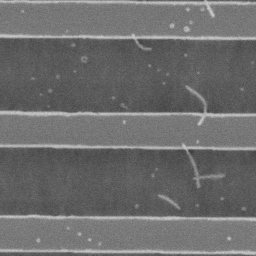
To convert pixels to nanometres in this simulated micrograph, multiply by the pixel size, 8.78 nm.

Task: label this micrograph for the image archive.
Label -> lines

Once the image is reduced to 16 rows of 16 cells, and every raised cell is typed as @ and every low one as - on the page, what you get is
@@@@@@@@@@@@@@@@
@@@@@@@@@@@@@@@@
----------------
----------------
----------------
----------------
----------------
@@@@@@@@@@@@@@@@
@@@@@@@@@@@@@@@@
----------------
----------------
----------------
----------------
-@@-------------
@@@@@@@@@@@@@@@@
@@@@@@@@@@@@@@@@